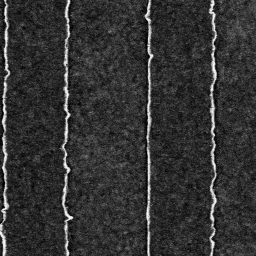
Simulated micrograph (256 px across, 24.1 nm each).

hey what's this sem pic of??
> one or a few lines or trenches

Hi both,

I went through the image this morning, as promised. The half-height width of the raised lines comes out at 1.54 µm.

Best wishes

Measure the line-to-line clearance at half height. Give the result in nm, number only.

1980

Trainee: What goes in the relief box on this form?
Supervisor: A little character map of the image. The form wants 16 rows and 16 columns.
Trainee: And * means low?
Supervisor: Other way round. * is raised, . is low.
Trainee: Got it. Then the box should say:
****.....****...
****.....****...
****.....****...
****.....****...
****.....****...
****.....****...
****.....****...
****.....****...
****.....****...
****.....****...
****.....****...
****.....****...
****.....****...
****.....****...
****.....****...
****.....****...